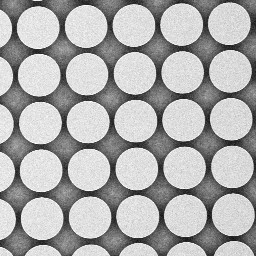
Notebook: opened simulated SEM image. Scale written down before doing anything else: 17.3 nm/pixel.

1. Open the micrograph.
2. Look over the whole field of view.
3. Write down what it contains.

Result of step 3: an array of small figures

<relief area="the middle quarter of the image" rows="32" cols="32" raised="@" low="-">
-@@@@@@@@@@--@@@@@@@@@@--@@@@@@@
-@@@@@@@@@@--@@@@@@@@@@--@@@@@@@
-@@@@@@@@@@--@@@@@@@@@@--@@@@@@@
-@@@@@@@@@@--@@@@@@@@@@--@@@@@@@
-@@@@@@@@@@--@@@@@@@@@@--@@@@@@@
-@@@@@@@@@----@@@@@@@@----@@@@@@
--@@@@@@@-----@@@@@@@------@@@@@
----@@@@------------------------
--------------------------------
----@@@---------@@@@-------@@@@@
---@@@@@@-----@@@@@@@@----@@@@@@
--@@@@@@@@---@@@@@@@@@---@@@@@@@
-@@@@@@@@@@--@@@@@@@@@@--@@@@@@@
-@@@@@@@@@@--@@@@@@@@@@--@@@@@@@
-@@@@@@@@@@--@@@@@@@@@@--@@@@@@@
-@@@@@@@@@@--@@@@@@@@@@--@@@@@@@
-@@@@@@@@@@--@@@@@@@@@@--@@@@@@@
--@@@@@@@@----@@@@@@@@----@@@@@@
---@@@@@@------@@@@@@------@@@@@
----@@@@------------------------
--------------------------------
-----@@@--------@@@@@------@@@@@
---@@@@@@@----@@@@@@@@----@@@@@@
--@@@@@@@@@---@@@@@@@@@---@@@@@@
-@@@@@@@@@@--@@@@@@@@@@--@@@@@@@
-@@@@@@@@@@--@@@@@@@@@@--@@@@@@@
-@@@@@@@@@@--@@@@@@@@@@--@@@@@@@
-@@@@@@@@@@--@@@@@@@@@@--@@@@@@@
-@@@@@@@@@@--@@@@@@@@@@---@@@@@@
--@@@@@@@@@---@@@@@@@@----@@@@@@
---@@@@@@@-----@@@@@@------@@@@@
-----@@@----------@-------------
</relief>